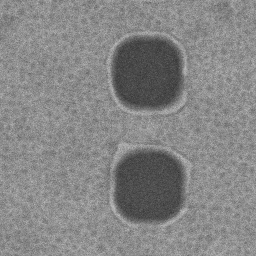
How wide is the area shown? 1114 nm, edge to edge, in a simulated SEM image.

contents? holes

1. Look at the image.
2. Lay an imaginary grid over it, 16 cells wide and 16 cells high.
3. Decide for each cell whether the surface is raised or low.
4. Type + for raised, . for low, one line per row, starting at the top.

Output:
++++++++++++++++
++++++++++++++++
++++++++..++++++
+++++++....+++++
+++++++....+++++
+++++++....+++++
++++++++...+++++
++++++++++++++++
++++++++++++++++
++++++++..++++++
+++++++....+++++
+++++++....+++++
+++++++....+++++
++++++++...+++++
++++++++++++++++
++++++++++++++++